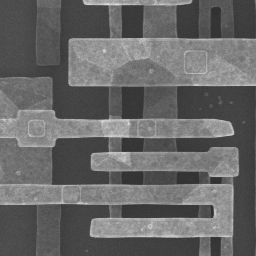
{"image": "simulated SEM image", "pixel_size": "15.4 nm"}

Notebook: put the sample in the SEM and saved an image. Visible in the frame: wiring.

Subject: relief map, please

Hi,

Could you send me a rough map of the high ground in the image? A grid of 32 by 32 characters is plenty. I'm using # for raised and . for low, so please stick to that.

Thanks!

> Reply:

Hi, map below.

...........############.........
................................
................................
................................
................................
.........#######################
.........#######################
.........#######################
.........#######################
.........#######################
.........#######################
................................
................................
................................
..#####.........................
#############################...
#############################...
..#####.........................
..........................###...
............##################..
...........###################..
..........................####..
................................
#############################...
#############################...
#############################...
...........................##...
............#################...
...........##################...
............#################...
................................
................................